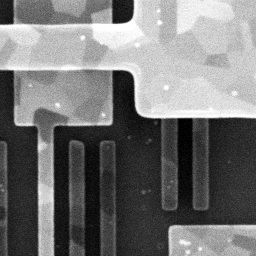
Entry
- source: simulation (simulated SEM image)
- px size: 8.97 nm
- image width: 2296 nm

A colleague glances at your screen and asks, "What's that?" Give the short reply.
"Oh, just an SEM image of wiring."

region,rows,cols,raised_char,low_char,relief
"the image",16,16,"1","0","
0000000011111111
0000000111111111
1111111111111111
1111111111111111
0000000011111111
0000000011111111
0000000011111111
0000000000000000
0000000000000000
0000000000000000
0000000000000000
0000000000000000
0000000000000000
0000000000000000
0000000000000000
0000000000000000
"